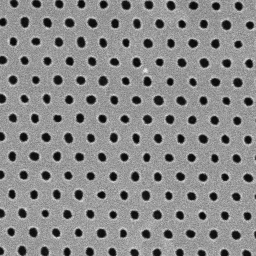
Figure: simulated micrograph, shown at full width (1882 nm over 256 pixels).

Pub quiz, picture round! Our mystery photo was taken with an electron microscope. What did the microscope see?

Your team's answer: a regular array of holes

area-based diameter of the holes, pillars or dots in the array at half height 66.6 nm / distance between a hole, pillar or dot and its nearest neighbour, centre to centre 21.8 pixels